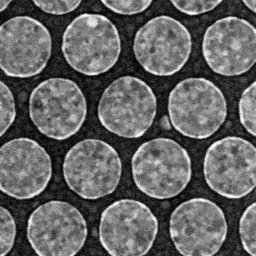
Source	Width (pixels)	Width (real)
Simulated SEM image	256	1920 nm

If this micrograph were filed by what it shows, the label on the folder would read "raised bodies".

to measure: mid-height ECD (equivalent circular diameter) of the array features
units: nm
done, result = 436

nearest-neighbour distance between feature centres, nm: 520